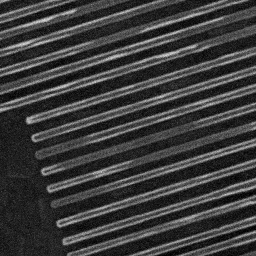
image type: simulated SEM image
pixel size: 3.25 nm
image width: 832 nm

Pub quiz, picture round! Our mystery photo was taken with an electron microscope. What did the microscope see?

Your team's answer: parallel lines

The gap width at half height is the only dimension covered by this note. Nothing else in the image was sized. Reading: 0.0328 um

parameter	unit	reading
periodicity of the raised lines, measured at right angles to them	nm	58.3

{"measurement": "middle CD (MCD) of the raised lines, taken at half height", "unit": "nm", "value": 25.6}